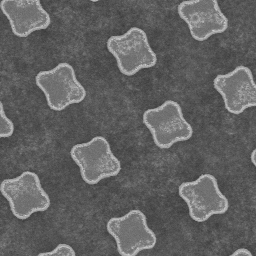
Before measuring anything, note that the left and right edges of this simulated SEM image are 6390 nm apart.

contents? raised bodies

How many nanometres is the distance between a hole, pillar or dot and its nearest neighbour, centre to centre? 1990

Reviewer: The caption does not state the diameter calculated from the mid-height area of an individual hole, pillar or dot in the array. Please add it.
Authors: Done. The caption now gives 41.8 pixels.